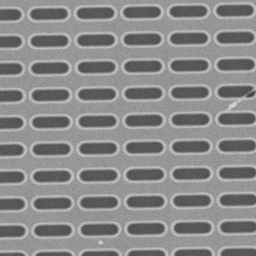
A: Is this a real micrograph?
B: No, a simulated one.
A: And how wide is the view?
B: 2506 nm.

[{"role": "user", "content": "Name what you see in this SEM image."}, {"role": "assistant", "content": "groups of lines, slits or small figures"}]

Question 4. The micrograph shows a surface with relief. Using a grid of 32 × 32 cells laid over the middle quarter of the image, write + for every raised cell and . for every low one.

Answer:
.++..........++..........+......
.++..........++.........+++.....
+++++...++++++++++++++++++++++++
++++++++++++++++++++++++++++++++
++++++++++++++++++++++++++++++++
+++++++++++++++++++++++++++++...
.+++.........++.........+++.....
..+..........++..........++.....
.+++.........+++........++++....
++++++++++++++++++++++++++++++++
++++++++++++++++++++++++++++++++
++++++++++++++++++++++++++++++++
+++++++++++++++++.......++++....
.+++.........++..........++.....
..+..........++..........++.....
.+++.........+++........++++....
++++++++++++++++++++++++++++++++
++++++++++++++++++++++++++++++++
++++++++++++++++++++++++++++++++
+++++.......++++........++++....
..++.........++..........++.....
..++.........++..........++.....
.+++........+++++......+++++++++
++++++++++++++++++++++++++++++++
++++++++++++++++++++++++++++++++
++++++++++++++++++++++++++++++++
+++++.......++++........++++....
..++.........++..........++.....
..++.........+++.........++.....
.++++.......++++++++++++++++++++
++++++++++++++++++++++++++++++++
++++++++++++++++++++++++++++++++